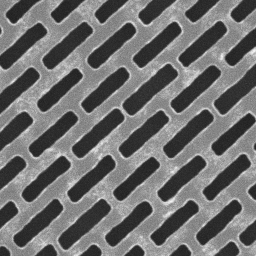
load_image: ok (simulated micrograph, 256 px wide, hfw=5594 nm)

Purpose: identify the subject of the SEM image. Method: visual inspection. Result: a regular array of holes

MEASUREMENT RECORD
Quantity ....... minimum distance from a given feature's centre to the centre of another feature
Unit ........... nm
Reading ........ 973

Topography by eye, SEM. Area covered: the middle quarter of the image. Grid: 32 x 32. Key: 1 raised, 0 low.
11111110011111111100111110011101
11001111111110001111111100001111
10000111111100001111111000000111
00001111110000001111100000001111
00001111110000011111000000011111
00011111100000011110000000111110
01111111000001111100000001111100
01111100000011111000000111111000
11111000000111110000001111100000
11110000001111100000011111100000
11110000011111100000111111100001
11111001111100100001111101110011
00011111111000010011111001111111
00001111110000011111100000111111
00011111100000011111000000111110
00111111000001111110000001111100
01111110000011111100000011111000
11111000000111111000000111110000
11110000001111110000001111100000
11100000011111100000011111000000
11000000111111000000111110000001
11000001111111000001111110000011
11000011111111000111111110001111
01100111110011101111100111011111
01111111100001111111000011111110
00111111000001111110000011111100
01111110000011111100000111111000
11111000000111111000001111110000
11110000001111110000011111000000
11100000011111100000111111000001
11000000111110000011111110000011
10000001111110000011111100000111